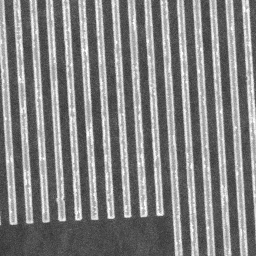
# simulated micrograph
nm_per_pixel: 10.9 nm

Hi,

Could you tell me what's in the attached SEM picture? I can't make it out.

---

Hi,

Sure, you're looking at parallel lines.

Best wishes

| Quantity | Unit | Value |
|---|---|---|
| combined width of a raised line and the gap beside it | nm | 177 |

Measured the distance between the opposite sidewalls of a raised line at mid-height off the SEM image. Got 63.7 nm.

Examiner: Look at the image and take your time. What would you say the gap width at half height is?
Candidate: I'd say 107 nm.